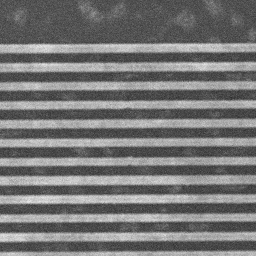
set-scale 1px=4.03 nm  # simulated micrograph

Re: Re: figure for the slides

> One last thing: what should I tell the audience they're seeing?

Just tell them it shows parallel lines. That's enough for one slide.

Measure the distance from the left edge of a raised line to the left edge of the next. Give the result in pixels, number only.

18.9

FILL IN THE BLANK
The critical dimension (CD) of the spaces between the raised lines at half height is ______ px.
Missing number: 11.6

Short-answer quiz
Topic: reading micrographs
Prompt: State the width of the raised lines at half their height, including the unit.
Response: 0.0287 micrometres